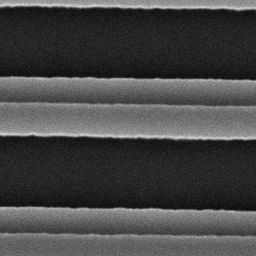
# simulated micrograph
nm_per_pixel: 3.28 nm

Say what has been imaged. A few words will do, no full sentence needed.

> lines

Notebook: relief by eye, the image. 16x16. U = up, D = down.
DDDDDDDDDDDDDDUU
DDDDDDDDDDDDDDDD
DDDDDDDDDDDDDDDD
DDDDDDDDDDDDDDDD
DDDDDDDDDDDDDDDD
UUUUUUUUUUUUUUUU
UUUUUUUUUUUUUUUU
UUUUUUUUUUUUUUUU
DDDDDDDUUUUUUUUU
DDDDDDDDDDDDDDDD
DDDDDDDDDDDDDDDD
DDDDDDDDDDDDDDDD
DDDDDDDDDDDDDDDD
UUUUUUUUUUUUUUUU
UUUUUUUUUUUUUUUU
UUUUUUUUUUUUUUUU